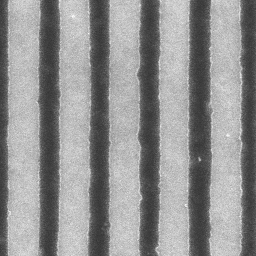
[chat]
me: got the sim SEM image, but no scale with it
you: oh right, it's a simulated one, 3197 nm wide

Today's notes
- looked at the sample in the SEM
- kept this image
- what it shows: parallel lines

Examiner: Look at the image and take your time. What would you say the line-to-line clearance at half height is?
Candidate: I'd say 358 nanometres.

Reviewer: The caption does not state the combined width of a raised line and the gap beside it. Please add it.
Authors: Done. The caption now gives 50.1 pixels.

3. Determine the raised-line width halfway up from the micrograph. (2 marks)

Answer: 273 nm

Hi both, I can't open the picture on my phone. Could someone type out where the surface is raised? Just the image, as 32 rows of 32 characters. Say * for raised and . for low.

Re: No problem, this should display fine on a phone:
*....**....***...***....**....**
*....**....***...***....**....**
*....***...***...***....**....**
*....***...***...***....**....**
*....***...***...***....**....**
*....***...***...***....**....**
*....***...***...***....**....**
*....***...***...***....**....**
*....***...***...***....**....**
*....**....***...***....**....**
*....***...***...***....**....**
*....***...***...***....**....**
*....***...***...***....**....**
*....***...***...***....***...**
*....**....***...***....***...**
*....**....***...***...***....**
*....***...***...***....**....**
*....**....***...***...***....**
*....***...***....**....**....**
*....**....***...***....***...**
*....**....***...***....***...**
*....**....***...***....**....**
*....***...***...***....**....**
*....**....***...***...***....**
*....**....***....**....**....**
*....**....***...***...***....**
*....**....***...***...***....**
*....**....***...***....**....**
*....**....***...***....**....**
*....**....***...***....**....**
*....**....***...***....**....**
*....**....***...***....**....**